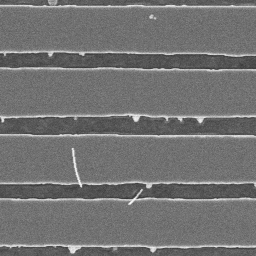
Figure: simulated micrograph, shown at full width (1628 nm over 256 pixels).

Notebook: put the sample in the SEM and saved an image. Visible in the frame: lines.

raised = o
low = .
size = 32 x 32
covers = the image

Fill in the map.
................................
oooooooooooooooooooooooooooooooo
oooooooooooooooooooooooooooooooo
oooooooooooooooooooooooooooooooo
oooooooooooooooooooooooooooooooo
oooooooooooooooooooooooooooooooo
ooooo...oooooooooooooooooooooooo
................................
................................
oooooooooooooooooooooooooooooooo
oooooooooooooooooooooooooooooooo
oooooooooooooooooooooooooooooooo
oooooooooooooooooooooooooooooooo
oooooooooooooooooooooooooooooooo
oooooooooooooo..oooooooooooooooo
................................
................................
oooooooooooooooooooooooooooooooo
oooooooooooooooooooooooooooooooo
oooooooooooooooooooooooooooooooo
oooooooooooooooooooooooooooooooo
oooooooooooooooooooooooooooooooo
oooooooooooooooooooooooooooooooo
................................
................................
oooooooooooooooooooooooooooooooo
oooooooooooooooooooooooooooooooo
oooooooooooooooooooooooooooooooo
oooooooooooooooooooooooooooooooo
oooooooooooooooooooooooooooooooo
oooooooooooooooooooooooooooooooo
................................